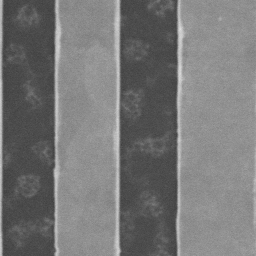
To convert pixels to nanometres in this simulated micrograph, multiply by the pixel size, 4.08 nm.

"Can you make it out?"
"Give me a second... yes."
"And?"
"one or a few lines or trenches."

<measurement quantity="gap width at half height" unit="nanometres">234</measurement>